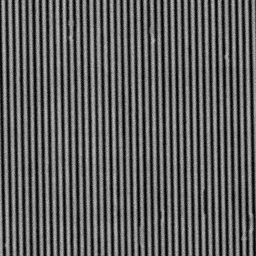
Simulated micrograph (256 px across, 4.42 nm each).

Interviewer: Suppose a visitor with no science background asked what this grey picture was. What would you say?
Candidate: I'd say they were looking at parallel lines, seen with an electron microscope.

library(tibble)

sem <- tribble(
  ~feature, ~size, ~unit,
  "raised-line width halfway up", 0.0127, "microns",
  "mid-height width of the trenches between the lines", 16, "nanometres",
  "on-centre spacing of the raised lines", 29.9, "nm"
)